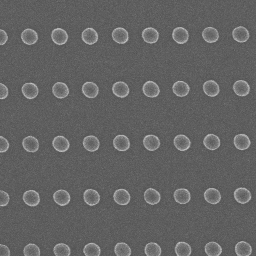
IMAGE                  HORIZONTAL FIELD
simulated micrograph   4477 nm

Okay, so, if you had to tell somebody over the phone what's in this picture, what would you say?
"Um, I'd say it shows a regular array of raised bodies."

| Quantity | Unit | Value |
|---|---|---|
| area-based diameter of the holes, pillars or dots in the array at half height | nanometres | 270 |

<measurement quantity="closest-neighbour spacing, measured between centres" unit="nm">525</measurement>